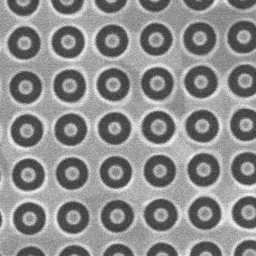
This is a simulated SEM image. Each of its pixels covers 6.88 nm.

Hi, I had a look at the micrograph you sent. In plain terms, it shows an array of small figures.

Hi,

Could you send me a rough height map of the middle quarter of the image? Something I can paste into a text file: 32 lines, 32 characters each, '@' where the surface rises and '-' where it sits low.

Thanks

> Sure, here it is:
@@@@@@@@@@@@@@@@@@@@@@@--@@@@@@@
----@@@@@@-----@@@@@------@@@@@-
-----@@@@-------@@@@-------@@@--
-----@@@--------@@@----@----@@--
@@@---@@---@@@---@@---@@@---@@--
@@@---@@---@@@---@@---@@@---@@--
@@@---@@---@@----@@@---@---@@@--
------@@--------@@@@-------@@@@-
-----@@@@-------@@@@@-----@@@@@@
----@@@@@@@----@@@@@@@@--@@@@@@@
@@@@@@@@@@@@@@@@@@@@@@@@@@@@@@@@
@@@@@@@@@@@@@@@@@@@@@@---@@@@@@@
----@@@@@@-----@@@@@@-----@@@@@-
-----@@@@-------@@@@-------@@@--
------@@---------@@---@@@---@@--
-@----@@---@@@---@@---@@@---@@--
@@@---@@---@@@---@@---@@@---@@--
-@@---@@----@----@@---------@@--
-----@@@@-------@@@@-------@@@@-
----@@@@@@-----@@@@@@-----@@@@@@
@--@@@@@@@@@@@@@@@@@@@@@@@@@@@@@
@@@@@@@@@@@@@@@@@@@@@@@@@@@@@@@@
@@@@@@@@@@@@@@@@@@@@@@@-@@@@@@@@
----@@@@@@@----@@@@@@------@@@@@
-----@@@@@------@@@@-------@@@@-
------@@@---@----@@@---@@---@@@-
-@@---@@@--@@@---@@@---@@---@@@-
-@@---@@@--@@@---@@@---@@---@@@-
-@@---@@@---@@---@@@--------@@@-
------@@@@-------@@@@------@@@@@
-----@@@@@------@@@@@@----@@@@@@
@--@@@@@@@@@@@@@@@@@@@@@@@@@@@@@